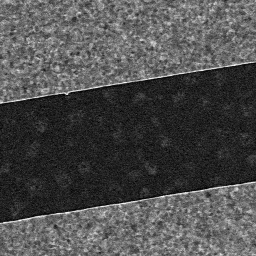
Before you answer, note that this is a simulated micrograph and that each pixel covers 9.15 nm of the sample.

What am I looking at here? one or a few lines or trenches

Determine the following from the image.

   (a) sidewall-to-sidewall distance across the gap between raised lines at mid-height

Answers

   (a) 1.08 µm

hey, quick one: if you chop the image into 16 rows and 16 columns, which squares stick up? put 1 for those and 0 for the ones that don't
1111111111111111
1111111111111111
1111111111111111
1111111111111111
1111111111110000
1111110000000000
0000000000000000
0000000000000000
0000000000000000
0000000000000000
0000000000000000
0000000000000001
0000000001111111
0001111111111111
1111111111111111
1111111111111111